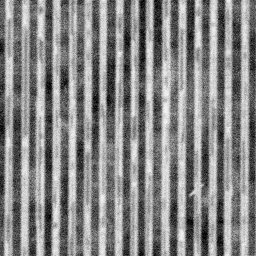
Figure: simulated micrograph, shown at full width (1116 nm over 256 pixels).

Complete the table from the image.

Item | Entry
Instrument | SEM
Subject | parallel lines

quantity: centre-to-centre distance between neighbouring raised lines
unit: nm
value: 68.5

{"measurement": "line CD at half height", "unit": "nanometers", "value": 25.6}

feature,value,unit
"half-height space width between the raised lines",0.0387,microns